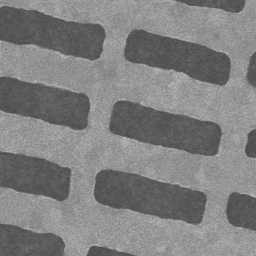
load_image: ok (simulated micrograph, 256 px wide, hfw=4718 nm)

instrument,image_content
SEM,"holes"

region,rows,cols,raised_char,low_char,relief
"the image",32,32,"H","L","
HHHHHHHHHHHHHHHHHHHHHHHLLLLLLLLH
LLLLLHHHHHHHHHHHHHHHHHHHHHHHHLHH
LLLLLLLLHHHHHHHHHHHHHHHHHHHHHHHH
LLLLLLLLLLLLLHHHHHHHHHHHHHHHHHHH
LLLLLLLLLLLLLHHHLLLLHHHHHHHHHHHH
HHLLLLLLLLLLLHHHLLLLLLLLLHHHHHHH
HHHHHHHLLLLLLHHHLLLLLLLLLLLHHHHH
HHHHHHHHHHHLHHHHLLLLLLLLLLLLLHHL
HHHHHHHHHHHHHHHHHHHHLLLLLLLLLHHL
HHHHHHHHHHHHHHHHHHHHHHHHLLLLLHHL
LLLLLHHHHHHHHHHHHHHHHHHHHHHLHHHL
LLLLLLLLLHHHHHHHHHHHHHHHHHHHHHHH
LLLLLLLLLLLHHHHHHHHHHHHHHHHHHHHH
LLLLLLLLLLLHHHLLLLLHHHHHHHHHHHHH
HHHLLLLLLLLHHHLLLLLLLLLLHHHHHHHH
HHHHHHLLLLLHHHLLLLLLLLLLLLLHHHHH
HHHHHHHHHHHHHHLLLLLLLLLLLLLLHHHL
HHHHHHHHHHHHHHHHHLLLLLLLLLLLHHHL
HHHHHHHHHHHHHHHHHHHHHLLLLLLHHHHL
LLLHHHHHHHHHHHHHHHHHHHHHHHLHHHHL
LLLLLLLHHHHHHHHHHHHHHHHHHHHHHHHH
LLLLLLLLLHHHLLLLHHHHHHHHHHHHHHHH
LLLLLLLLLHHHLLLLLLLHHHHHHHHHHHHH
HLLLLLLLLHHHLLLLLLLLLLLLHHHHHHHH
HHHHHLLLHHHHLLLLLLLLLLLLLLHHHLLH
HHHHHHHHHHHHHLLLLLLLLLLLLLHHLLLL
HHHHHHHHHHHHHHHHHLLLLLLLLLHHLLLL
HHHHHHHHHHHHHHHHHHHHHHLLLHHHHLLL
LLLHHHHHHHHHHHHHHHHHHHHHHHHHHHHL
LLLLLLLHHHHHHHHHHHHHHHHHHHHHHHHH
LLLLLLLLHHHHHHHHHHHHHHHHHHHHHHHH
LLLLLLLLHHHLLLLHHHHHHHHHHHHHHHHH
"